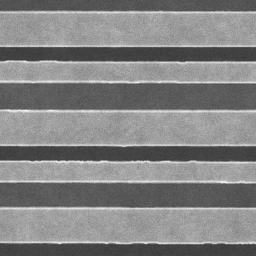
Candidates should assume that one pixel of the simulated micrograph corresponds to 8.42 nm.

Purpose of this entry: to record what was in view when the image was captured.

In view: lines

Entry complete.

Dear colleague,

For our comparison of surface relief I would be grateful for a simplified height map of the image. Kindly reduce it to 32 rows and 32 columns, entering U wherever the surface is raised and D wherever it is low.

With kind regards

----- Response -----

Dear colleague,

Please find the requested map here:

DDDDDDDDDDDDDDDDDDDDDDDDDDDDDDDD
DDDDDDDDDDDDDDDDDDDDDDDDDDDDDDDD
UUUUUUUUUUUUUUUUUUUUUUUUUUUUUUUU
UUUUUUUUUUUUUUUUUUUUUUUUUUUUUUUU
UUUUUUUUUUUUUUUUUUUUUUUUUUUUUUUU
UUUUUUUUUUUUUUUUUUUUUUUUUUUUUUUU
DDDDDDDDDDDDDDDDDDDDDDDDDDDDDDDD
DDDDDDDDDDDDDDDDDDDDDDDDDDDDDDDD
UUUUUUUUUUUUUUUUUUUUUUUUUUUUUUUU
UUUUUUUUUUUUUUUUUUUUUUUUUUUUUUUU
DDDDDDDDDDDDDDDDDDDDDDDDDDDDDDDD
DDDDDDDDDDDDDDDDDDDDDDDDDDDDDDDD
DDDDDDDDDDDDDDDDDDDDDDDDDDDDDDDD
DDDDDDDDDDDDDDDDDDDDDDDDDDDDDDDD
UUUUUUUUUUUUUUUUUUUUUUUUUUUUUUUU
UUUUUUUUUUUUUUUUUUUUUUUUUUUUUUUU
UUUUUUUUUUUUUUUUUUUUUUUUUUUUUUUU
UUUUUUUUUUUUUUUUUUUUUUUUUUUUUUUU
DDDDDDDDDDDDDDDDDDDDDDDDDDDDDDDD
DDDDDDDDDDDDDDDDDDDDDDDDDDDDDDDD
UUUUUUUUUUUUUUUUUUUUUUUUUUUUUUUU
UUUUUUUUUUUUUUUUUUUUUUUUUUUUUUUU
UUUUUUUUUUUUUUUUUUUUUUUUUUUUUUUU
DDDDDDDDDDDDDDDDDDDDDDDDDDDDDDDD
DDDDDDDDDDDDDDDDDDDDDDDDDDDDDDDD
DDDDDDDDDDDDDDDDDDDDDDDDDDDDDDDD
UUUUUUUUUUUUUUUUUUUUUUUUUUUUUUUU
UUUUUUUUUUUUUUUUUUUUUUUUUUUUUUUU
UUUUUUUUUUUUUUUUUUUUUUUUUUUUUUUU
UUUUUUUUUUUUUUUUUUUUUUUUUUUUUUUU
DDDDDDDDDDDDDDDDDDDDDDDDDDDDDDDD
DDDDDDDDDDDDDDDDDDDDDDDDDDDDDDDD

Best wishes